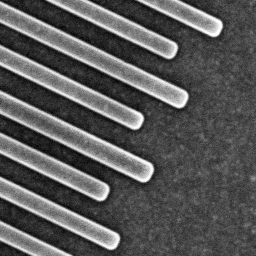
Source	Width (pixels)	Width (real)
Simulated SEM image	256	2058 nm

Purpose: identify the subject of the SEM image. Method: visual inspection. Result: parallel lines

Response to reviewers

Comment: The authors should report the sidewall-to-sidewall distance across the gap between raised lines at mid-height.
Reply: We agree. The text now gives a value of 183 nanometers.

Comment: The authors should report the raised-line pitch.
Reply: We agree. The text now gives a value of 319 nanometres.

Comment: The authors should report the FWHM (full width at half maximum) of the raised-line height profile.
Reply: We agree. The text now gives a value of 16.4 px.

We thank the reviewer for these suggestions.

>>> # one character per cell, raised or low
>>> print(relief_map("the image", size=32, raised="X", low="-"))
-------XXXXX------XXXXX---------
XXX------XXXXX------XXXXX-------
XXXXX------XXXXX------XXXXX-----
--XXXXX------XXXXX-------XXX----
----XXXXX------XXXXX------------
------XXXXX------XXXXX----------
X-------XXXXX-------XX----------
XXX-------XXXXX-----------------
-XXXXX------XXXXX---------------
---XXXXX------XXXXX-------------
-----XXXXX------XXXXX-----------
-------XXXXX------XXXXX---------
XX-------XXXXX------XXX---------
XXXX-------XXXXX----------------
-XXXXX-------XXXXX--------------
---XXXXX-------XXX--------------
-----XXXXX----------------------
XX-----XXXXX--------------------
XXXX-----XXXXXX-----------------
-XXXXX-----XXXXXX---------------
---XXXXX-----XXXXXX-------------
-----XXXXX-----XXXX-------------
X------XXXXX-----X--------------
XXX------XXXX-------------------
XXXXX------XX-------------------
--XXXXX-------------------------
----XXXXX-----------------------
------XXXXX---------------------
XX------XXXXX-------------------
XXXX-------XXXX-----------------
-XXXXX-------XX-----------------
---XXXXX------------------------